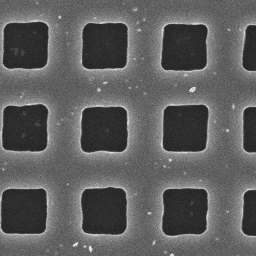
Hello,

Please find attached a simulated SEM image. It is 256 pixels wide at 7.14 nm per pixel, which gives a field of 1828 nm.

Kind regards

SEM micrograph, a regular array of holes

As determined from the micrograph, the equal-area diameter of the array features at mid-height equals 363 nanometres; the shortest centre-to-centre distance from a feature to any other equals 566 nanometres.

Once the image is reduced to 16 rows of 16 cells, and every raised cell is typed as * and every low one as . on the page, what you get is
****************
*..***..********
...**...**...**.
...**...**...**.
****************
****************
****************
...**...**...**.
...**...**...**.
****************
****************
****************
...**...**...**.
...**...**...**.
...**...**...**.
****************